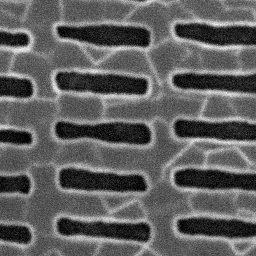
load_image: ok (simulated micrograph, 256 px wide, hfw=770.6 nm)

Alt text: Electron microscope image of holes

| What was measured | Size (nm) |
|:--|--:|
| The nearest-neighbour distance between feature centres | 146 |